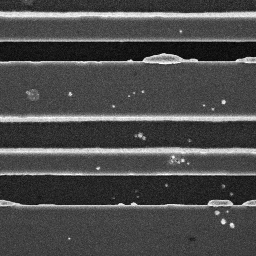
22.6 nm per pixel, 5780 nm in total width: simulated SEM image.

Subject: lines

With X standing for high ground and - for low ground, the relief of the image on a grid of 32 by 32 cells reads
--------------------------------
--------------------------------
XXXXXXXXXXXXXXXXXXXXXXXXXXXXXXXX
XXXXXXXXXXXXXXXXXXXXXXXXXXXXXXXX
XXXXXXXXXXXXXXXXXXXXXXXXXXXXXXXX
--------------------------------
--------------------------------
------------------XXXXXXX-----XX
XXXXXXXXXXXXXXXXXXXXXXXXXXXXXXXX
XXXXXXXXXXXXXXXXXXXXXXXXXXXXXXXX
XXXXXXXXXXXXXXXXXXXXXXXXXXXXXXXX
XXXXXXXXXXXXXXXXXXXXXXXXXXXXXXXX
XXXXXXXXXXXXXXXXXXXXXXXXXXXXXXXX
XXXXXXXXXXXXXXXXXXXXXXXXXXXXXXXX
XXXXXXXXXXXXXXXXXXXXXXXXXXXXXXXX
--------------------------------
--------------------------------
--------------------------------
--------------------------------
XXXXXXXXXXXXXXXXXXXXXXXXXXXXXXXX
XXXXXXXXXXXXXXXXXXXXXXXXXXXXXXXX
XXXXXXXXXXXXXXXXXXXXXXXXXXXXXXXX
--------------------------------
--------------------------------
--------------------------------
XX--------------X---------XXX-XX
XXXXXXXXXXXXXXXXXXXXXXXXXXXXXXXX
XXXXXXXXXXXXXXXXXXXXXXXXXXXXXXXX
XXXXXXXXXXXXXXXXXXXXXXXXXXXXXXXX
XXXXXXXXXXXXXXXXXXXXXXXXXXXXXXXX
XXXXXXXXXXXXXXXXXXXXXXXXXXXXXXXX
XXXXXXXXXXXXXXXXXXXXXXXXXXXXXXXX